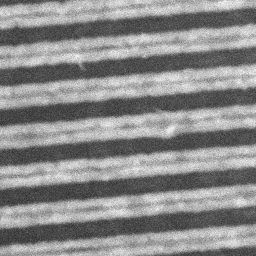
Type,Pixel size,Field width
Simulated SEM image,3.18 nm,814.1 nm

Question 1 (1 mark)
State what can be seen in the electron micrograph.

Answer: parallel lines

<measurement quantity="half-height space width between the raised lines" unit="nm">71.7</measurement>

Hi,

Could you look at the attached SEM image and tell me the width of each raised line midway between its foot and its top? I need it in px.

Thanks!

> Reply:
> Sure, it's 16.7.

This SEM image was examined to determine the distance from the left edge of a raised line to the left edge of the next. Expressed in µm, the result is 0.126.